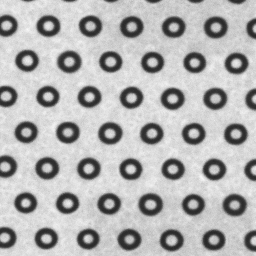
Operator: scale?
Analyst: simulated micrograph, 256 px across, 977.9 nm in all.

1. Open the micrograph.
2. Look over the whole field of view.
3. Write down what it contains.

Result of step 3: a regular array of ring-shaped grooves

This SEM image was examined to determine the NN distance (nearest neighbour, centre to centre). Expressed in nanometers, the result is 156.